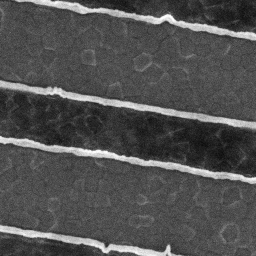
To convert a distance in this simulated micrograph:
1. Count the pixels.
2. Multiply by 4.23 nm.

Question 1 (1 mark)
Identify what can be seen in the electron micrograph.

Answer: one or a few lines or trenches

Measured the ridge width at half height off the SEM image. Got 235 nm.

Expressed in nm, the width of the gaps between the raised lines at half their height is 369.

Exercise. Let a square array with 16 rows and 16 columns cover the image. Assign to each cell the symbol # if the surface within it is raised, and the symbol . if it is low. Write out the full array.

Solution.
.....###########
...........#####
................
................
................
##..............
########........
##############..
################
.....###########
...........#####
................
................
................
#...............
########........